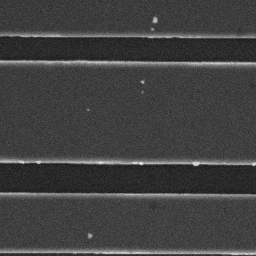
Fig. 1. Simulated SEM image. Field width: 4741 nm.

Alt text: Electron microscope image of lines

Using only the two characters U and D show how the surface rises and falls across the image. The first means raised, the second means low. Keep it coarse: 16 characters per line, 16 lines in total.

UUUUUUUUUUUUUUUU
UUUUUUUUUUUUUUUU
DDDDDDDDDDDDDDDD
DDDDDDDDDDDDDDDD
UUUUUUUUUUUUUUUU
UUUUUUUUUUUUUUUU
UUUUUUUUUUUUUUUU
UUUUUUUUUUUUUUUU
UUUUUUUUUUUUUUUU
UUUUUUUUUUUUUUUU
DDDDDDDDDDDDDDDD
DDDDDDDDDDDDDDDD
UUUUUUUUUUUUUUUU
UUUUUUUUUUUUUUUU
UUUUUUUUUUUUUUUU
UUUUUUUUUUUUUUUU